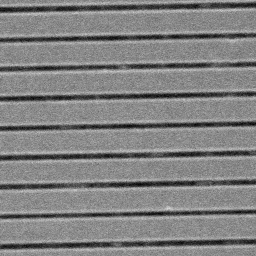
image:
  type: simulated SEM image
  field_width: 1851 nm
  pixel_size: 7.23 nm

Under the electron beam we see parallel lines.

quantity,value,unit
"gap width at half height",55.1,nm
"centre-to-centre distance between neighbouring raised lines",213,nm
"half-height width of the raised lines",160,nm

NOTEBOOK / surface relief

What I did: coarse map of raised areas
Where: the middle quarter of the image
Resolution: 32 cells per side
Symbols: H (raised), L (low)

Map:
LLLLLLLLLLLLLLLLLLLLLLLLLLLLLLLL
LLLLLLLLLLLLLLLLLLLLLLLLLLLLLHHH
HHHHHHHHHHHHHHHHHHHHHHHHHHHHHHHH
HHHHHHHHHHHHHHHHHHHHHHHHHHHHHHHH
HHHHHHHHHHHHHHHHHHHHHHHHHHHHHHHH
HHHHHHHHHHHHHHHHHHHHHHHHHHHHHHHH
HHHHHHHHHHHHHHHHHHHHHHHHHHHHHHHH
HLHLLLLLLLLLLLLLLLLLLLLLLLLLLLLL
LLLLLLLLLLLLLLLLLLLLLLLLLLLLLLLL
HHHHHHHHHHHHHHHHHHHHHHHHHHHHHHHH
HHHHHHHHHHHHHHHHHHHHHHHHHHHHHHHH
HHHHHHHHHHHHHHHHHHHHHHHHHHHHHHHH
HHHHHHHHHHHHHHHHHHHHHHHHHHHHHHHH
HHHHHHHHHHHHHHHHHHHHHHHHHHHHHHHH
HHHHHHHHHHHHHHHLLLLLLLLLLLLLLLLL
LLLLLLLLLLLLLLLLLLLLLLLLLLLLLLLL
LLLLLLLLLLLLHHHHHHHLHHHHHHHHHHHH
HHHHHHHHHHHHHHHHHHHHHHHHHHHHHHHH
HHHHHHHHHHHHHHHHHHHHHHHHHHHHHHHH
HHHHHHHHHHHHHHHHHHHHHHHHHHHHHHHH
HHHHHHHHHHHHHHHHHHHHHHHHHHHHHHHH
HHHHHHHHHHHHHHHHHHHHHHHHHHHLLLHH
LLLLLLLLLLLLLLLLLLLLLLLLLLLLLLLL
LLLLLLLLLLLLLLLLLLLLLLLLLLLLLLLL
HHHHHHHHHHHHHHHHHHHHHHHHHHHHHHHH
HHHHHHHHHHHHHHHHHHHHHHHHHHHHHHHH
HHHHHHHHHHHHHHHHHHHHHHHHHHHHHHHH
HHHHHHHHHHHHHHHHHHHHHHHHHHHHHHHH
HHHHHHHHHHHHHHHHHHHHHHHHHHHHHHHH
LLLLLLLLLLLLLLLLLLLLLLLLLLLLLLLL
LLLLLLLLLLLLLLLLLLLLLLLLLLLLLLLL
HHHHHHHHHHHHHHHHHHHHHHHHHHHHHHHH